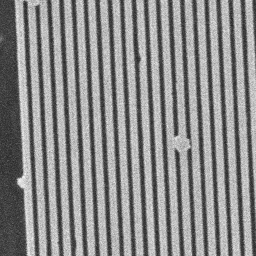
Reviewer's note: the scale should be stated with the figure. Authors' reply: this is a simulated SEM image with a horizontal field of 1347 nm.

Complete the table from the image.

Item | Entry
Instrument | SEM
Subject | parallel lines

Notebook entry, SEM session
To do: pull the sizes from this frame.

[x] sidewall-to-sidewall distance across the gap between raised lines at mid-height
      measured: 0.0256 microns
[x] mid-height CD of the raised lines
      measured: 36.1 nm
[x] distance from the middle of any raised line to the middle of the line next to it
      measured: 63.5 nm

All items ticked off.